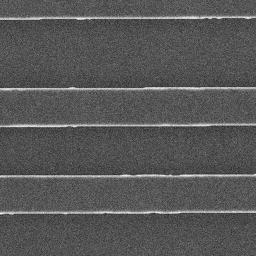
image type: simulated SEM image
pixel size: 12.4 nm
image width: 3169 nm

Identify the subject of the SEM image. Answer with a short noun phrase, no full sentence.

lines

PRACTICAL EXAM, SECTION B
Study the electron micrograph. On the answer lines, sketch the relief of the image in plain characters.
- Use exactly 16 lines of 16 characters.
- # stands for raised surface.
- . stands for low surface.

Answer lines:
################
................
................
................
................
....#....#######
################
################
................
................
................
################
################
................
................
................